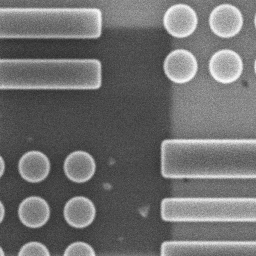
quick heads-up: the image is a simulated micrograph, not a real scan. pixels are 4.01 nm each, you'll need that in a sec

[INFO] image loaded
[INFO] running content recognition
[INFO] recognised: groups of lines, slits or small figures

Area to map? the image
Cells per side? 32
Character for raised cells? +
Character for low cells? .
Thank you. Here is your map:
................................
++++++++++++.........+++...+++..
+++++++++++++........+++..++++..
+++++++++++++........+++...+++..
++++++++++++..........+.....+...
................................
......................+.....+...
.....................+++..++++..
+++++++++++++........+++..++++..
+++++++++++++........+++...+++..
+++++++++++++...................
................................
................................
................................
................................
................................
................................
................................
....................++++++++++++
...++....++.........++++++++++++
..++++..++++........++++++++++++
...+++..++++........++++++++++++
....+....++.....................
................................
................................
...+++..+++.........++++++++++++
..++++..++++........++++++++++++
...+++..+++....................+
................................
................................
...++....++..........+++++++++++
...+++..++++........++++++++++++